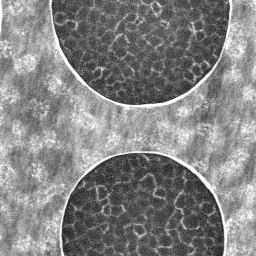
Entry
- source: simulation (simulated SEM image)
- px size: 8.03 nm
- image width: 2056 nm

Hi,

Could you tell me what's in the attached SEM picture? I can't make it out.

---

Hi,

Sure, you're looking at holes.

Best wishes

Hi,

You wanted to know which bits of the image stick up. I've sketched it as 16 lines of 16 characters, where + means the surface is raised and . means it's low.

+++...........++
+++...........++
++++..........++
++++..........++
+++++........+++
++++++......++++
++++++++.+++++++
++++++++++++++++
++++++++++++++++
++++++++++++++++
++++++......++++
+++++........+++
++++..........++
++++..........++
++++..........++
++++..........++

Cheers